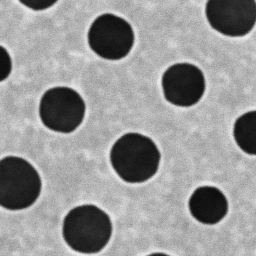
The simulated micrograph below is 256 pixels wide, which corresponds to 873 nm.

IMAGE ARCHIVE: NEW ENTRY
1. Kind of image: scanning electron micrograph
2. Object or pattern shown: holes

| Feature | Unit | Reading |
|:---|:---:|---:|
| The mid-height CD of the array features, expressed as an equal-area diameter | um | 0.16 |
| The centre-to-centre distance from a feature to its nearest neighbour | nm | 296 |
